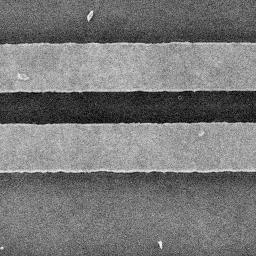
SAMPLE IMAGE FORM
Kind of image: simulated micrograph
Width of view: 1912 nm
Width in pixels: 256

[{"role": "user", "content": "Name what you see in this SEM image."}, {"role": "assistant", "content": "lines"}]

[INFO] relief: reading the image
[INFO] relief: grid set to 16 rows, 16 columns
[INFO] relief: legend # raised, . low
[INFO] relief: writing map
................
................
................
################
################
################
................
................
################
################
################
................
................
................
................
................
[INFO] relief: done